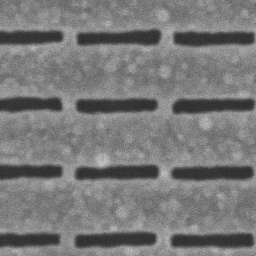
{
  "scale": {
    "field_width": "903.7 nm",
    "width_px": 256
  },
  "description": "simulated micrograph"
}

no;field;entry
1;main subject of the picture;a regular array of holes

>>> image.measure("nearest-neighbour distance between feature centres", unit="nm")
236